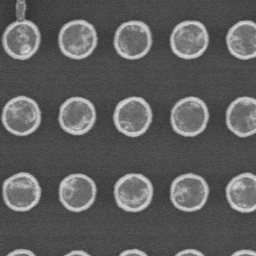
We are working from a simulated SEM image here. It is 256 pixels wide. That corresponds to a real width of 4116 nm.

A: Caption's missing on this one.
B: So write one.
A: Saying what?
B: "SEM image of a regular array of raised bodies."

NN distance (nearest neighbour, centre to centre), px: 55.6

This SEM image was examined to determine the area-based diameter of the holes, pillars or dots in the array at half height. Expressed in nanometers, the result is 575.